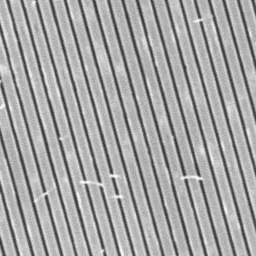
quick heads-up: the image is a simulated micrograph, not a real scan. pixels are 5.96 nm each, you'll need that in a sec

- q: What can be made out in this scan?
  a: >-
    parallel lines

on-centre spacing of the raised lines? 83 nm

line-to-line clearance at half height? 20.8 nm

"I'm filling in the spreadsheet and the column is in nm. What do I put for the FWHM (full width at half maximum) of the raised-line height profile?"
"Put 62.5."